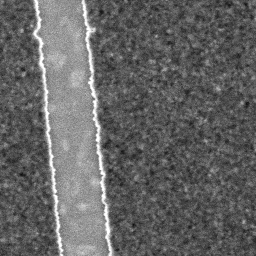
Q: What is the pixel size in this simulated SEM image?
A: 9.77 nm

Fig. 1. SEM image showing one or a few lines or trenches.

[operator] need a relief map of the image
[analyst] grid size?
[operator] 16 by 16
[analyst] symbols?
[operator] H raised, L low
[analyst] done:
HHLLLHHHHHHHHHHH
HHLLLHHHHHHHHHHH
HHLLLHHHHHHHHHHH
HHHLLLHHHHHHHHHH
HHHLLLHHHHHHHHHH
HHHLLLHHHHHHHHHH
HHHLLLHHHHHHHHHH
HHHLLLHHHHHHHHHH
HHHLLLHHHHHHHHHH
HHHLLLHHHHHHHHHH
HHHLLLHHHHHHHHHH
HHHLLLHHHHHHHHHH
HHHHLLHHHHHHHHHH
HHHHLLLHHHHHHHHH
HHHHLLLHHHHHHHHH
HHHHLLLHHHHHHHHH